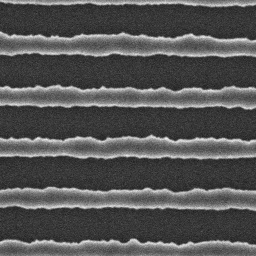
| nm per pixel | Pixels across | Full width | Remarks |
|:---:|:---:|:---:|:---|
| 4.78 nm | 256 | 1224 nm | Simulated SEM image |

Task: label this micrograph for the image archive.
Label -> lines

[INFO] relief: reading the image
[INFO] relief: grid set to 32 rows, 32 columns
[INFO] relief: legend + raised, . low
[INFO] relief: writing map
.....++++...+++..+++...+++++++++
................................
................................
................................
+++++....+++++++++.....+++......
++++++++++++++++++++++++++++++++
++++++++++++++++++++++++++++++++
................................
................................
................................
................................
++++++++++++++++++++++++++++++++
++++++++++++++++++++++++++++++++
..............................++
................................
................................
................................
+++++++.++++.++++++++...++++++..
++++++++++++++++++++++++++++++++
...+.....++++++..+++++++++++++++
................................
................................
................................
......+.........................
++++++++++++++++++++++++++++++++
++++++++++++++++++++++++++++++++
................................
................................
................................
................................
++++++++++++++++++++++.++++++++.
++++++++++++++++++++++++++++++++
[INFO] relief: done